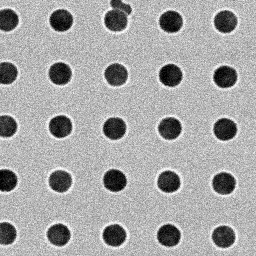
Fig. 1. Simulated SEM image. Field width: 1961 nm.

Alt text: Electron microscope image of a regular array of holes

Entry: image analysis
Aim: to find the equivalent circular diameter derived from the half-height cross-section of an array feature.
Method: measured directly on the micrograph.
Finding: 187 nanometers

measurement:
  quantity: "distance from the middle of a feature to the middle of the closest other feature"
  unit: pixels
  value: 53.2